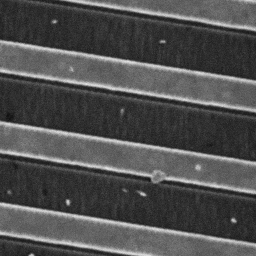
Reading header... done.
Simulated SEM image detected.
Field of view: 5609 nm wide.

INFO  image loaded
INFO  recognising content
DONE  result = lines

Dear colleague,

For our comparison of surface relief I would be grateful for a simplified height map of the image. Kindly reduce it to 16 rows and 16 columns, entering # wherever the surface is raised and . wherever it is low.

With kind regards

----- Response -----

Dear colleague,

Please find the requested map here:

.......#########
.............###
................
######..........
############....
.......#########
.............###
................
######..........
############....
......##########
............####
................
#####...........
###########.....
.....###########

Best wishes